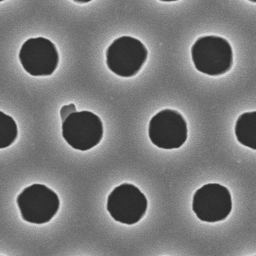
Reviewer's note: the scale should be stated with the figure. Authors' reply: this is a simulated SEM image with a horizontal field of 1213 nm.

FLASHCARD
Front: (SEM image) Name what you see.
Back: a regular array of holes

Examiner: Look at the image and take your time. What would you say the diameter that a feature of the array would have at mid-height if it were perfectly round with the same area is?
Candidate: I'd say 187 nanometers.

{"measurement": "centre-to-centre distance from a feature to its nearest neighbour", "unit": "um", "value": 0.404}